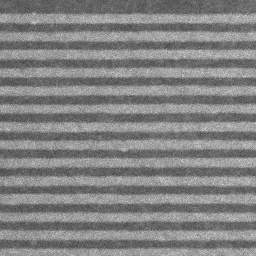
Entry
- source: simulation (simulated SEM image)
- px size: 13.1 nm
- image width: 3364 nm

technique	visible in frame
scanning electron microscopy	parallel lines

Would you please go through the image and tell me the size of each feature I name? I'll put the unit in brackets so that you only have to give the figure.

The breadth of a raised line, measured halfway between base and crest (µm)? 0.113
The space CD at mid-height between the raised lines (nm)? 128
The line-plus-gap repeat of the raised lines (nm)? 238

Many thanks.